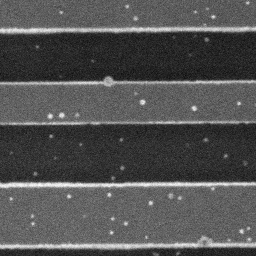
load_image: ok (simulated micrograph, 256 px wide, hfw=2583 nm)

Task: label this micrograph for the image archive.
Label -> lines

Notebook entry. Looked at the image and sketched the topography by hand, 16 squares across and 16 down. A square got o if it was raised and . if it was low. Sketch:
oooooooooooooooo
oooooooooooooooo
................
................
................
oooooooooooooooo
oooooooooooooooo
oooooooooooooooo
................
................
................
...........o.ooo
oooooooooooooooo
oooooooooooooooo
oooooooooooooooo
................